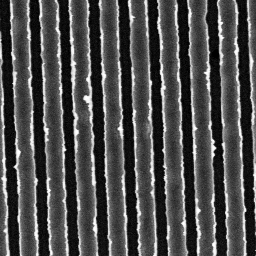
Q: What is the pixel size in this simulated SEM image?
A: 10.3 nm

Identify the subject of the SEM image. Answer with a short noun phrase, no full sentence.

parallel lines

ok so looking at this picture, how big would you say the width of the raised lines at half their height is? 186 nanometres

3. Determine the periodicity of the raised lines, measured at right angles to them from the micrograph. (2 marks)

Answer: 305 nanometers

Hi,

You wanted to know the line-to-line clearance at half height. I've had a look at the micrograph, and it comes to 117 nm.